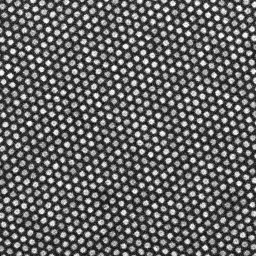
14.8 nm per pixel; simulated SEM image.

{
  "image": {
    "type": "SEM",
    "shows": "a regular array of raised bodies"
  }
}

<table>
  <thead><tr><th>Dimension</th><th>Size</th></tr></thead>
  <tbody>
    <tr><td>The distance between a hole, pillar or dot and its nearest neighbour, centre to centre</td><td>132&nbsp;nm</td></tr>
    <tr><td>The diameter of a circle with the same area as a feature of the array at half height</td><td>5.04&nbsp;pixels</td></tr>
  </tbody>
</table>